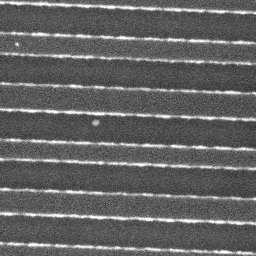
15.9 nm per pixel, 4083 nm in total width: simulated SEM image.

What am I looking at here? lines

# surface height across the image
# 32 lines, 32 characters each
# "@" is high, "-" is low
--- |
----@@@@@@@@@@@@@@@@@@@@@@@@@@@@
-----------------------------@@@
--------------------------------
--------------------------------
@@@@@@@@@-----------------------
@@@@@@@@@@@@@@@@@@@@@@@@@@@@@@@@
@@@@@@@@@@@@@@@@@@@@@@@@@@@@@@@@
--------------------@@@@@@@@@@@@
--------------------------------
--------------------------------
@@------------------------------
@@@@@@@@@@@@@@@@@@@@@@@@@@@@----
@@@@@@@@@@@@@@@@@@@@@@@@@@@@@@@@
@@@@@@@@@@@@@@@@@@@@@@@@@@@@@@@@
-------------------@@@@@@@@@@@@@
--------------------------------
--------------------------------
--------------------------------
@@@@@@@@@@@@@@@@@@@@@@@@@@------
@@@@@@@@@@@@@@@@@@@@@@@@@@@@@@@@
-----------------@@@@@@@@@@@@@@@
--------------------------------
--------------------------------
--------------------------------
@@@@@@@@@@@@@@@@@@@@@@----------
@@@@@@@@@@@@@@@@@@@@@@@@@@@@@@@@
@@@@@@@@@@@@@@@@@@@@@@@@@@@@@@@@
--------------------@@@@@@@@@@@@
--------------------------------
--------------------------------
@@@-----------------------------
@@@@@@@@@@@@@@@@@@@@@@@@@@------